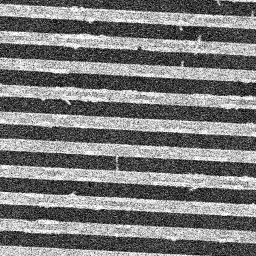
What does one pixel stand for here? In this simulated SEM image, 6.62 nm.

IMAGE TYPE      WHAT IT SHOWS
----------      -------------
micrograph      parallel lines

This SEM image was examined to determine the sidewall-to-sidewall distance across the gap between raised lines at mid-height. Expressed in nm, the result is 102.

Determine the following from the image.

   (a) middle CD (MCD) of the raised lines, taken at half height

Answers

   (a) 76.8 nm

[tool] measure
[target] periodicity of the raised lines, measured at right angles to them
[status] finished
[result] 177 nm